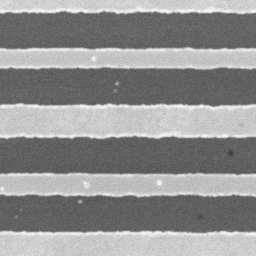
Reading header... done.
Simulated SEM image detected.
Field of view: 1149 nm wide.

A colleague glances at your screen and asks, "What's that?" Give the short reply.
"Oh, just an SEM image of lines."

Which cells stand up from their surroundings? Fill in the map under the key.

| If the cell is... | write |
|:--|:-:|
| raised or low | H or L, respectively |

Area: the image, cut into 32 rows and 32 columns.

HHHHHHHHHHHHHHHHHHHHHHHHHHHHHHHH
HHHLHHHLLHLHLLHHHLLLHHHHLHLLHHHH
LLLLLLLLLLLLLLLLLLLLLLLLLLLLLLLL
LLLLLLLLLLLLLLLLLLLLLLLLLLLLLLLL
LLLLLLLLLLLLLLLLLLLLLLLLLLLLLLLL
LLLLLLLLLLLLLLLLLLLLLLLLLLLLLLLL
HHHHHHHHHHHHHHHHHHHHHHHHHHHHHHHH
HHHHHHHHHHHHHHHHHHHHHHHHHHHHHHHH
HLLLHLLLLLLLLLLHLLLLLLHLHHHLLLHH
LLLLLLLLLLLLLLLLLLLLLLLLLLLLLLLL
LLLLLLLLLLLLLLLLLLLLLLLLLLLLLLLL
LLLLLLLLLLLLLLLLLLLLLLLLLLLLLLLL
LLLLLLLLLLLLLLLLLLLLLLLLLLLLLLLL
HHHHHHHHHHHHHHHHHHHHHHHHHHHHHHHH
HHHHHHHHHHHHHHHHHHHHHHHHHHHHHHHH
HHHHHHHHHHHHHHHHHHHHHHHHHHHHHHHH
HHHHHHHHHHHHHHHHHHHHHHHHHHHHHHHH
LLLLLLLLLLLLLLLLLLLLLLLLLLLLLLLL
LLLLLLLLLLLLLLLLLLLLLLLLLLLLLLLL
LLLLLLLLLLLLLLLLLLLLLLLLLLLLLLLL
LLLLLLLLLLLLLLLLLLLLLLLLLLLLLLLL
LLLLLLLLLLLLLLLLLLLLLLLLLLLLLLLL
HHHHHHHHHHHHHHHHHHHHHHHHHHHHHHHH
HHHHHHHHHHHHHHHHHHHHHHHHHHHHHHHH
LLLLLLLLLLLLLLLLLLLLLLLLLLLLLLLL
LLLLLLLLLLLLLLLLLLLLLLLLLLLLLLLL
LLLLLLLLLLLLLLLLLLLLLLLLLLLLLLLL
LLLLLLLLLLLLLLLLLLLLLLLLLLLLLLLL
LLLLLLLLLLLLLLLLLLLLLLLLLLLLLLLL
HHHHHHHHHHHHHHHHHHHHHHHHHHHHHHHH
HHHHHHHHHHHHHHHHHHHHHHHHHHHHHHHH
HHHHHHHHHHHHHHHHHHHHHHHHHHHHHHHH